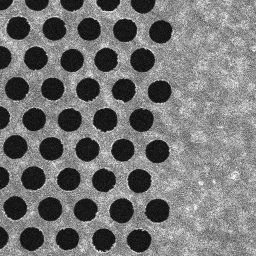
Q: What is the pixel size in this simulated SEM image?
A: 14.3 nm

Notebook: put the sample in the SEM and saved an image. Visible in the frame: a regular array of holes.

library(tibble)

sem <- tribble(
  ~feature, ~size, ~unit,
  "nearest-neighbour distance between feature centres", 493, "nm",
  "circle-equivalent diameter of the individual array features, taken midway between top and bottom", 341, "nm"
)